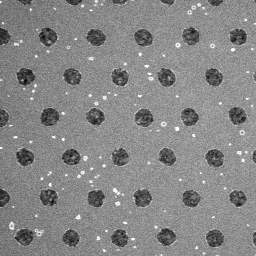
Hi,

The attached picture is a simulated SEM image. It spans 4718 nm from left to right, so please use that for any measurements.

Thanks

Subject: a regular array of raised bodies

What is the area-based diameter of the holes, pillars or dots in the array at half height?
18.8 pixels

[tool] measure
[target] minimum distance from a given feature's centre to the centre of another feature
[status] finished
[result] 844 nm